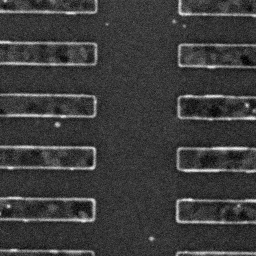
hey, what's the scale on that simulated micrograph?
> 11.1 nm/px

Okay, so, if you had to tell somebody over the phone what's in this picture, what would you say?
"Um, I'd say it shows wiring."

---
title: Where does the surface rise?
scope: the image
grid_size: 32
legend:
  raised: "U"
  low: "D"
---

UUUUUUUUUUUUDDDDDDDDDDUUUUUUUUUU
DDDDDUUUUUUUDDDDDDDDDDDUUUUUUUUU
DDDDDDDDDDDDDDDDDDDDDDDDDDDDDDDD
DDDDDDDDDDDDDDDDDDDDDDDDDDDDDDDD
DDDDDDDDDDDDDDDDDDDDDDDDDDDDDDDD
UUUUUUUUUUUUDDDDDDDDDDDDDDDDDDDD
UUUUUUUUUUUUDDDDDDDDDDUUUUUUUUUU
UUUUUUUUUUUUDDDDDDDDDDUUUUUUUUUU
DDDDDDDDDDDDDDDDDDDDDDDDDDDDDDDD
DDDDDDDDDDDDDDDDDDDDDDDDDDDDDDDD
DDDDDDDDDDDDDDDDDDDDDDDDDDDDDDDD
DDDDDDDDDDDDDDDDDDDDDDDDDDDDDDDD
UUUUUUUUUUUUDDDDDDDDDDUUUUUUUUUU
UUUUUUUUUUUUDDDDDDDDDDUUUUUUUUUU
DDDDDDUUUUUUDDDDDDDDDDUUUUUUUUUU
DDDDDDDDDDDDDDDDDDDDDDDDDDDDDDDD
DDDDDDDDDDDDDDDDDDDDDDDDDDDDDDDD
DDDDDDDDDDDDDDDDDDDDDDDDDDDDDDDD
UUUUUUDDDDDDDDDDDDDDDDDDDDDDDDDD
UUUUUUUUUUUUDDDDDDDDDDUUUUUUUUUU
UUUUUUUUUUUUDDDDDDDDDDUUUUUUUUUU
DDDDDDDDDDDDDDDDDDDDDDDDDDDDDDDD
DDDDDDDDDDDDDDDDDDDDDDDDDDDDDDDD
DDDDDDDDDDDDDDDDDDDDDDDDDDDDDDDD
DDDDDDDDDDDDDDDDDDDDDDDDDDDDDDDD
UUUUUUUUUUUUDDDDDDDDDDUUUUUUUUUU
UUUUUUUUUUUUDDDDDDDDDDUUUUUUUUUU
DDDDDDDDDDUDDDDDDDDDDDUUUUUUUUUU
DDDDDDDDDDDDDDDDDDDDDDDDDDDDDDDD
DDDDDDDDDDDDDDDDDDDDDDDDDDDDDDDD
DDDDDDDDDDDDDDDDDDDDDDDDDDDDDDDD
UUUUUUUUUUUDDDDDDDDDDDDDDDDDDDDD